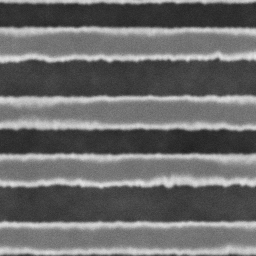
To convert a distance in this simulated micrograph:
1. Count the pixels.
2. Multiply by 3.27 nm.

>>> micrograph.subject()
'lines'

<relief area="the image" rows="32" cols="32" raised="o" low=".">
................................
................................
................................
oooooooooooooooooooo..ooooo.oo..
oooooooooooooooooooooooooooooooo
oooooooooooooooooooooooooooooooo
oooooooooooooooooooooooooooooooo
ooo..ooo...o.o.ooo.....o....o...
................................
................................
................................
................................
oooooooooooooooooooooooooooooooo
oooooooooooooooooooooooooooooooo
oooooooooooooooooooooooooooooooo
oooooooooooooooooooooooooooooooo
................................
................................
................................
oooooooooooooooooooooooooooooooo
oooooooooooooooooooooooooooooooo
oooooooooooooooooooooooooooooooo
oooooooooooooooooooooooooooooooo
................................
................................
................................
................................
................................
oooooooooooooooooooooooooooooooo
oooooooooooooooooooooooooooooooo
oooooooooooooooooooooooooooooooo
oooooooooooooooooooooooooooooooo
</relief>